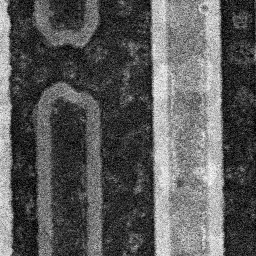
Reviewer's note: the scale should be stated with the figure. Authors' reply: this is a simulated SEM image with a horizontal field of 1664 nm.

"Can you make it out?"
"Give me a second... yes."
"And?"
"one or a few lines or trenches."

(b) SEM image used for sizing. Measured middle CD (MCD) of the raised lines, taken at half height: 352 nm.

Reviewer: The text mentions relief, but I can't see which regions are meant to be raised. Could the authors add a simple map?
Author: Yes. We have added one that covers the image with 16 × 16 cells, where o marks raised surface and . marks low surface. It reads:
...ooo....ooo...
...ooo....ooo...
..........ooo...
..........ooo...
..........ooo...
..........ooo...
...oo.....ooo...
...ooo....ooo...
...ooo....ooo...
...ooo....ooo...
...ooo....ooo...
...ooo....oooo..
...ooo....oooo..
...ooo....ooo...
...ooo....ooo...
...ooo....oooo..